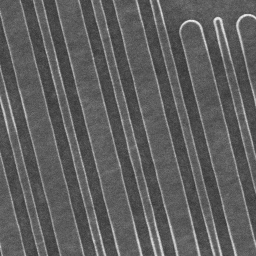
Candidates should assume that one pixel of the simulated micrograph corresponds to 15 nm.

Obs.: groups of lines, slits or small figures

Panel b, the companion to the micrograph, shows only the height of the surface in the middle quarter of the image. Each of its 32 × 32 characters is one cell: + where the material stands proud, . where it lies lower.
..++++++...++...++++++...+++...+
..++++++...++....++++++...++...+
..++++++....++...++++++...++...+
...++++++...++...++++++...+++...
...++++++...++...++++++....++...
...++++++...++....++++++...++...
...++++++...+++...++++++...++...
....++++++...++...++++++...++...
+...++++++...++...++++++...+++..
+...++++++...+++...++++++...++..
+...++++++....++...++++++...++..
+....++++++...++...++++++...+++.
++...++++++...++...++++++....++.
++...++++++...++....+++++....++.
++...++++++...+++...++++++...++.
++....++++++...++...++++++...++.
+++...++++++...++....+++++...+++
.++...++++++...++....++++++...++
.++...++++++....++...++++++...++
.++....+++++....++...++++++...++
..++...++++++...++...++++++....+
..++...++++++...++....+++++....+
..++...++++++...+++...++++++...+
..++....++++++..+++...++++++...+
..+++...++++++...++...++++++...+
...++...++++++...++....++++++...
...++...++++++...+++...++++++...
...++....+++++....++...++++++...
...+++...++++++...++...++++++...
+...++...++++++...++....++++++..
+...++...++++++....++...++++++..
+...++....+++++....++...++++++..